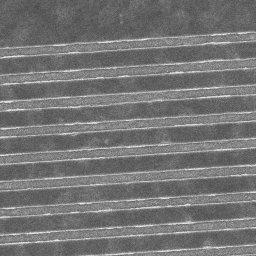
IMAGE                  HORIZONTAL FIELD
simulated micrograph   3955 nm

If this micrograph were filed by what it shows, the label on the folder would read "parallel lines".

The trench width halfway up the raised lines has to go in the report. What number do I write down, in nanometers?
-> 125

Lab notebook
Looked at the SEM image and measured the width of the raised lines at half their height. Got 283 nm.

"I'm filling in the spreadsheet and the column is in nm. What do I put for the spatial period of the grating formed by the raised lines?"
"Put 410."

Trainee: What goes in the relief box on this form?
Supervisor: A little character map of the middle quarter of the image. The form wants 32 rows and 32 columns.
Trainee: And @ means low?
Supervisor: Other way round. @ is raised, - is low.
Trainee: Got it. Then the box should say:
@@@@@@@@@@@@@@@@@@@-------------
@@@@----------------------------
-------------------------@@@@@@@
--------@@@@@@@@@@@@@@@@@@@@@@@@
@@@@@@@@@@@@@@@@@@@@@@@@@@@@@@@@
@@@@@@@@@@@@@@@@@@@@@@@@@@@@@@@@
@@@@@@@@@@@@@@@@@@@@@@@@@@@@@@@-
@@@@@@@@@@@@@-------------------
--------------------------------
-------------------@@-@@@@@@@@@@
----@-@-@@@@@@@@@@@@@@@@@@@@@@@@
@@@@@@@@@@@@@@@@@@@@@@@@@@@@@@@@
@@@@@@@@@@@@@@@@@@@@@@@@@@@@@@@@
@@@@@@@@@@@@@@@@@@@@@@@@@@------
@@@@@@@@@@----------------------
---------------------------@@@@@
-------------@@@@@@@@@@@@@@@@@@@
@@@@@@@@@@@@@@@@@@@@@@@@@@@@@@@@
@@@@@@@@@@@@@@@@@@@@@@@@@@@@@@@@
@@@@@@@@@@@@@@@@@@@@@@@@@@@@@@@@
@@@@@@@@@@@@@@@@@@@@@-----------
@@@@@---------------------------
-------------------------@@@@@@@
-----@-@@@@@@@@@@@@@@@@@@@@@@@@@
@@@@@@@@@@@@@@@@@@@@@@@@@@@@@@@@
@@@@@@@@@@@@@@@@@@@@@@@@-@@@@@@@
@@@@@@@@@@@@@@@@@@@@@@@@@@@@----
@@@@@@@@@@@@@-------------------
--------------------------------
-------------------@@@@@@@@@@--@
----@@@@@@@@@@@@-@@@@@@@@@@@@@@@
@@@@@@@@@@@@@@@@@@@@@@@@@@@@@@@@